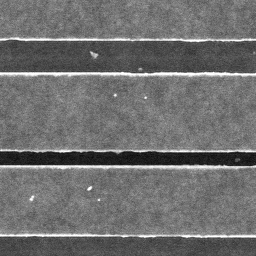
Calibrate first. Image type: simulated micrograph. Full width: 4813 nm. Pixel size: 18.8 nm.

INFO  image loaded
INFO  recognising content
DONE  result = lines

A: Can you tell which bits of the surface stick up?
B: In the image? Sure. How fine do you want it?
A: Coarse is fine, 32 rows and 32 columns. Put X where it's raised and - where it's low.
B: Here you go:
XXXXXXXXXXXXXXXXXXXXXXXXXXXXXXXX
XXXXXXXXXXXXXXXXXXXXXXXXXXXXXXXX
XXXXXXXXXXXXXXXXXXXXXXXXXXXXXXXX
XXXXXXXXXXXXXXXXXXXXXXXXXXXXXXXX
XXXXXXXXXXXXXXXXXXXXXXXXXXXXXXXX
--------------------------------
--------------------------------
--------------------------------
--------------------------------
XXXXXXXXXXXXXXXXXXXXXXXXXXXXXXXX
XXXXXXXXXXXXXXXXXXXXXXXXXXXXXXXX
XXXXXXXXXXXXXXXXXXXXXXXXXXXXXXXX
XXXXXXXXXXXXXXXXXXXXXXXXXXXXXXXX
XXXXXXXXXXXXXXXXXXXXXXXXXXXXXXXX
XXXXXXXXXXXXXXXXXXXXXXXXXXXXXXXX
XXXXXXXXXXXXXXXXXXXXXXXXXXXXXXXX
XXXXXXXXXXXXXXXXXXXXXXXXXXXXXXXX
XXXXXXXXXXXXXXXXXXXXXXXXXXXXXXXX
XXXXXXXXXXXXXXXXXXXXXXXXXXXXXXXX
--------------------------------
--------------------------------
XXXXXXXXXXXXXXXXXXXXXXXXXXXXXXXX
XXXXXXXXXXXXXXXXXXXXXXXXXXXXXXXX
XXXXXXXXXXXXXXXXXXXXXXXXXXXXXXXX
XXXXXXXXXXXXXXXXXXXXXXXXXXXXXXXX
XXXXXXXXXXXXXXXXXXXXXXXXXXXXXXXX
XXXXXXXXXXXXXXXXXXXXXXXXXXXXXXXX
XXXXXXXXXXXXXXXXXXXXXXXXXXXXXXXX
XXXXXXXXXXXXXXXXXXXXXXXXXXXXXXXX
---------------X-XXX---XXXXXXXXX
--------------------------------
--------------------------------